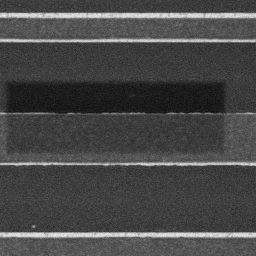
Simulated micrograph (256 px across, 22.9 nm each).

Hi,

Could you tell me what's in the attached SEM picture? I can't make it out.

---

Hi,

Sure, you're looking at lines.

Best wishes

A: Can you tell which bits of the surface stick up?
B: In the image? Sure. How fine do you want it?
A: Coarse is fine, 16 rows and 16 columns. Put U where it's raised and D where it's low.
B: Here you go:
DDDDDDDDDDDDDDDD
UUUUUUUUUUUUUUUU
UUUUUUUUUUUUUUUU
DDDDDDDDDDDDDDDD
DDDDDDDDDDDDDDDD
DDDDDDDDDDDDDDDD
DDDDDDDDDDDDDDDD
UUUUUUUUUUUUUUUU
UUUUUUUUUUUUUUUU
UUUUUUUUUUUUUUUU
DDDDDDDDDDDDDDDD
DDDDDDDDDDDDDDDD
DDDDDDDDDDDDDDDD
DDDDDDDDDDDDDDDD
DDDDDDDDDDDDDDDD
UUUUUUUUUUUUUUUU